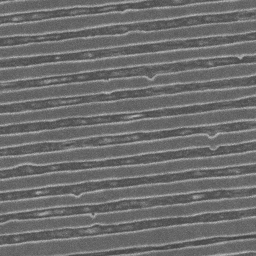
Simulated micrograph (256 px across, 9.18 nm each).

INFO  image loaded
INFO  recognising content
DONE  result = parallel lines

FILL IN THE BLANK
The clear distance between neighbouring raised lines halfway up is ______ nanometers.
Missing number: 88.9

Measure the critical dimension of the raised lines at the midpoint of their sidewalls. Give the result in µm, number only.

0.116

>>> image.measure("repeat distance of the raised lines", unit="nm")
202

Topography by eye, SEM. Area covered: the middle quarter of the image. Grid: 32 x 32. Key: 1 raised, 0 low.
11111111111111111100000000000000
11111111100000000000000000000000
11100000000000000000000000111111
00000000000000011111101111111111
00000011111111111111111111111111
11111111111111111111110000000000
11111111111111100000000000000000
11111111000000000000000000001111
00000000000000000011011111111111
00000000011011111111111111111111
00111111111111111111111111111100
11111111111111111111110000000000
11111111111100000000000000000000
10000000000000000000000011111111
00000000000000001111111111111111
00000011111111111111111111111111
11111111111111111111111100000000
11111111111111100000000000000000
11111000000000000000000000011111
00000000000000000011111111111111
00000000000111111111111111111111
01111111111111111111111111110000
11111111111111111111000000000000
11111111111100000000000000000000
10000000000000000000000011111111
00000000000000011111111111111111
00000111111111111111111111111110
11111111111111111111111100000000
11111111111111100000000000000000
11111000000000000000000000001111
00000000000000000001111111111111
00000000001111111111111111111111